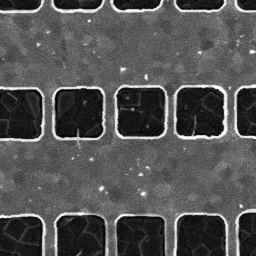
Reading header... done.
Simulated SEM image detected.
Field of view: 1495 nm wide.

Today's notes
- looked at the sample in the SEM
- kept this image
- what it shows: holes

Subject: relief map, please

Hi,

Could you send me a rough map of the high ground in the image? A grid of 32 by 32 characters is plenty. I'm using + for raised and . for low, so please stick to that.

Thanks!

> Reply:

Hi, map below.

.....++......+......++......++..
++++++++++++++++++++++++++++++++
++++++++++++++++++++++++++++++++
++++++++++++++++++++++++++++++++
++++++++++++++++++++++++++++++++
++++++++++++++++++++++++++++++++
++++++++++++++++++++++++++++++++
++++++++++++++++++++++++++++++++
++++++++++++++++++++++++++++++++
++++++++++++++++++++++++++++++++
++++++++++++++++++++++++++++++++
.....++......++......+......++..
.....+++.....++......+......++..
.....++......++......+......++..
.....++......++......+......++..
.....++......++......+......++..
.....++......++.....++......++..
++++++++++++++++++++++++++++++++
++++++++++++++++++++++++++++++++
++++++++++++++++++++++++++++++++
++++++++++++++++++++++++++++++++
++++++++++++++++++++++++++++++++
++++++++++++++++++++++++++++++++
++++++++++++++++++++++++++++++++
++++++++++++++++++++++++++++++++
++++++++++++++++++++++++++++++++
+++++++++++++++++++++++++++++++.
.....++......++.....++......++..
.....++......++......+......++..
.....++......++......+......++..
.....++......++......+......++..
.....++......++......+......++..